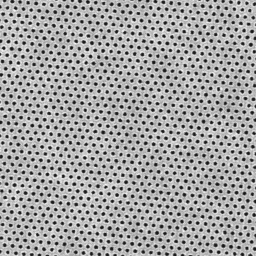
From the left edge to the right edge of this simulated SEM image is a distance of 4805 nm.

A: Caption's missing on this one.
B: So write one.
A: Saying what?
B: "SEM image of a regular array of holes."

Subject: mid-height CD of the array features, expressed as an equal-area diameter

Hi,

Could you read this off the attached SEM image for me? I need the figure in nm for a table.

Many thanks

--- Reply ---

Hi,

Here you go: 76.4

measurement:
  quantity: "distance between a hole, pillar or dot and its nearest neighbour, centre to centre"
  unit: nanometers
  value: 142